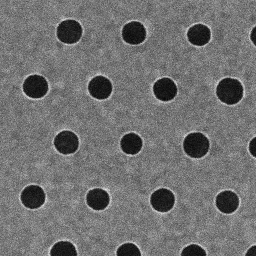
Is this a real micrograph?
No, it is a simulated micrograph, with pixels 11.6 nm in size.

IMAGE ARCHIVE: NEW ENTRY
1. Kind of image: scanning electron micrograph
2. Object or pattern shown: a regular array of holes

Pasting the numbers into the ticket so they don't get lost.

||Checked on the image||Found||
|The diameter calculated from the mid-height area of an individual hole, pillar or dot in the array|289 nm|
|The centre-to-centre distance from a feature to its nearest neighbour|743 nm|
